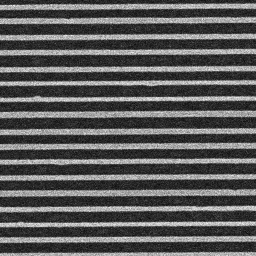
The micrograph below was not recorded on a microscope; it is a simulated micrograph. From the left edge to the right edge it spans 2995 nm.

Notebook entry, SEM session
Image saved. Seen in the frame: parallel lines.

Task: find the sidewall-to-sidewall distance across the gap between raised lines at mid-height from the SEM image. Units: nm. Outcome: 123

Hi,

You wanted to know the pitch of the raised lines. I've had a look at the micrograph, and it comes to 0.181 microns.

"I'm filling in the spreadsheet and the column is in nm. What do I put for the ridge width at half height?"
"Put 55.6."